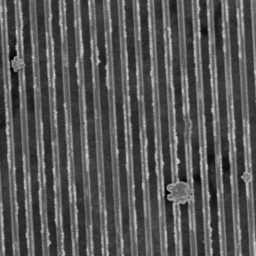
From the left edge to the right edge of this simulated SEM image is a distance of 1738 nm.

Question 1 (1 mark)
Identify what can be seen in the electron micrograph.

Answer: parallel lines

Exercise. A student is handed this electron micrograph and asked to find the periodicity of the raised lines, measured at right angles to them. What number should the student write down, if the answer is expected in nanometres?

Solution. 100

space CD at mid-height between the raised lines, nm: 57.6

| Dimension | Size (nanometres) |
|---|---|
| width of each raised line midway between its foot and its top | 39.8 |